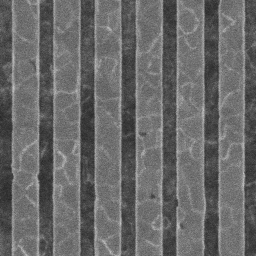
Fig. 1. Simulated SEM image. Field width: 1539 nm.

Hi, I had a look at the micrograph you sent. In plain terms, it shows parallel lines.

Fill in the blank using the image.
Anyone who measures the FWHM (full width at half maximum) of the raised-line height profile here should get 159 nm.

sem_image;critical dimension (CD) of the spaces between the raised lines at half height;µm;0.0871